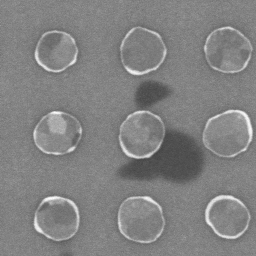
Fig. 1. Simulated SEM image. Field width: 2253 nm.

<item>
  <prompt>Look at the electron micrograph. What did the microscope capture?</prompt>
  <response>a regular array of raised bodies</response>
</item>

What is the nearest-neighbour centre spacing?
0.734 micrometres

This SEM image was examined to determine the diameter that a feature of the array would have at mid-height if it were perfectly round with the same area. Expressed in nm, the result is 396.